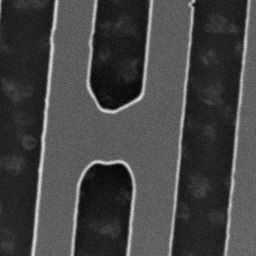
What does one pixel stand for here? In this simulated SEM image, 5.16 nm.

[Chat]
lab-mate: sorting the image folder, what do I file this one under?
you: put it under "one or a few lines or trenches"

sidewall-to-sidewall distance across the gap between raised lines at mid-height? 281 nanometers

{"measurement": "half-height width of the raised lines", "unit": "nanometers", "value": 221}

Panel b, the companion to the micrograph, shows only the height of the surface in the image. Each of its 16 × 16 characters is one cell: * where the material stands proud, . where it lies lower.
...***...***....
...***...***...*
...***...***...*
...***...***...*
...***...***...*
...***...***...*
...***..****...*
...********....*
...********....*
...********....*
...***..***....*
..***...***...**
..***...***...**
..***...***...**
..***...***...**
..***...***...**